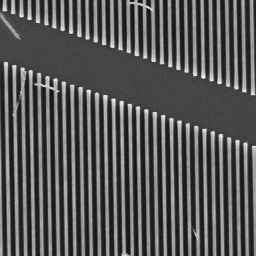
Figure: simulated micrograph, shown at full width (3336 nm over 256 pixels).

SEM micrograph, parallel lines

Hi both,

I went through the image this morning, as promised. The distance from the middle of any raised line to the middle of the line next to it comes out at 0.107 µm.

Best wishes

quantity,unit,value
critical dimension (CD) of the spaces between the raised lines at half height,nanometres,61.9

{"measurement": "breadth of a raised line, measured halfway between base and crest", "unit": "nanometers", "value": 37.4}